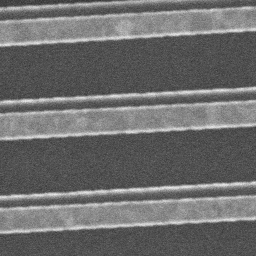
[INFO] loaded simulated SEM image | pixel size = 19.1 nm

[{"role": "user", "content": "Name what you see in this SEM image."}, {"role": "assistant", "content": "lines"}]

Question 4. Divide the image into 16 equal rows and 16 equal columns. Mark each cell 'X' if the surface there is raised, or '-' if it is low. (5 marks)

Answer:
-XXXXXXXXXXXXXXX
XXXXXXXXXXXXXXXX
XXXXX-----------
----------------
----------------
----------------
XXXXXXXXXXXXXXXX
XXXXXXXXXXXXXXXX
XXXX------------
----------------
----------------
---------------X
XXXXXXXXXXXXXXXX
XXXXXXXXXXXXXXXX
X---------------
----------------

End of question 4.